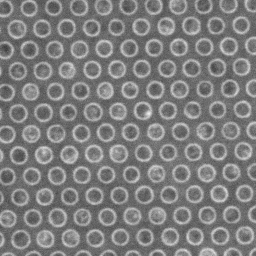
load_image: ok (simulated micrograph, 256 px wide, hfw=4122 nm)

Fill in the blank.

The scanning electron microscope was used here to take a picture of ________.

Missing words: a regular array of raised bodies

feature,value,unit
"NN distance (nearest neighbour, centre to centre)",390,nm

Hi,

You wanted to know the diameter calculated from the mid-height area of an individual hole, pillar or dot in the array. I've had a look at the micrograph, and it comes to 254 nm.